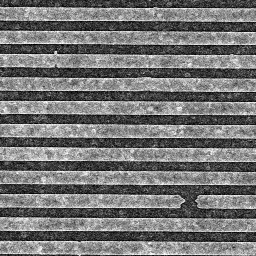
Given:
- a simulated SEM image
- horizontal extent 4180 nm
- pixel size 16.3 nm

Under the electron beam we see parallel lines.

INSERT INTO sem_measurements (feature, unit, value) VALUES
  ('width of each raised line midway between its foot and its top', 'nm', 218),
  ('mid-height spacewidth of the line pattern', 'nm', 163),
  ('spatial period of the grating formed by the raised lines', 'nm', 382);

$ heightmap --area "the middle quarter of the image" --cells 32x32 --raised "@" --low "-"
@@@@@@@@@@@@@@@@@@@@@@@@@@@@@@@@
--------------------------------
--------------------------------
--------------------@@--------@@
@@@@@@@@@@@@@@@@@@@@@@@@@@@@@@@@
@@@@@@@@@@@@@@@@@@@@@@@@@@@@@@@@
@@@@@@@@@@@@@@@@@@@@-@@@@@@@@@@@
--------------------------------
--------------------------------
@@@@@@@@@@@@@@@@@@@@@@----------
@@@@@@@@@@@@@@@@@@@@@@@@@@@@@@@@
@@@@@@@@@@@@@@@@@@@@@@@@@@@@@@@@
----@@@@@@------@@@---@@@@@@@@@@
--------------------------------
--------------------------------
@@@@@@@@@@@@@@@@@@@@@@@@@@@@@@@@
@@@@@@@@@@@@@@@@@@@@@@@@@@@@@@@@
@@@@@@@@@@@@@@@@@@@@@@@@@@@@@@@@
--------------------------------
--------------------------------
--------------------------------
@@@@@@@@@@@@@@@@@@@@@@@@@@@@@@@@
@@@@@@@@@@@@@@@@@@@@@@@@@@@@@@@@
@@@@@@@@@@@@@@@@@@@@@@@@@@@@@@@@
--------------------------------
--------------------------------
----------------------@---------
@@@@@@@@@@@@@@@@@@@@@@@@@@@@@@@@
@@@@@@@@@@@@@@@@@@@@@@@@@@@@@@@@
@@@@@@@@@@@@@@@@@@@@@@@@@@@@@@@@
--------------------------------
---------@----------------------